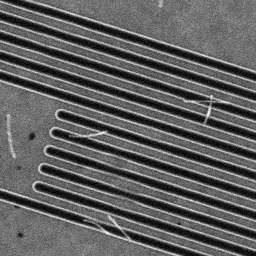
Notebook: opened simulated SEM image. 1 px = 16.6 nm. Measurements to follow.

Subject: groups of lines, slits or small figures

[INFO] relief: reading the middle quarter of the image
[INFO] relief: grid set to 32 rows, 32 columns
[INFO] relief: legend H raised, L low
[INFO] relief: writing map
LLLHHHHHHHHHLLLLLLLHHHHHHHHHLLLL
LLLLLLLHHHHHHHHLLLLLLLLHHHHHHHHL
HHHLLLLLLLHHHHHHHHHLLLLLLHHHHHHH
HHHHHHLLLLLLLHHHHHHHHLLLLLLLHHHH
LHHHHHHHHLLLLLLLHHHHHHHHHLLLLLLL
LLLHHHHHHHHHLLLLLLLHHHHHHHHHLLLL
LLLLLLLHHHHHHHHHLLLLLLLHHHHHHHHL
HHHLLLLLLLHHHHHHHHLLLLLLLLHHHHHH
HHHHHHLLLLLLLHHHHHHHHLLLLLLLLHHH
LHHHHHHHHLLLLLLLHHHHHHHHHLLLLLLL
LLLHHHHHHHHHLLLLLLLHHHHHHHHHLLLL
LLLLLLLHHHHHHHHHLLLLLLLHHHHHHHHL
HHHLLLLLLLHHHHHHHHLLLLLLLLHHHHHH
HHHHHHHLLLLLLLHHHHHHHHLLLLLLLHHH
LHHHHHHHHLLLLLLLHHHHHHHHHLLLLLLL
LLLLHHHHHHHHHLLLLLLLHHHHHHHHLLLL
LLLLLLLHHHHHHHHHLLLLLLLHHHHHHHHH
HHHLLLLLLLLHHHHHHHLLLLLLLLHHHHHH
HHHHHHHLLLLLLLHHHHHHHHLLLLLLLHHH
LHHHHHHHHLLLLLLLHHHHHHHHHLLLLLLL
LLLLHHHHHHHHHLLLLLLLHHHHHHHHHLLL
LLLLLLLHHHHHHHHHLLLLLLLHHHHHHHHH
HHHHLLLLLLLHHHHHHHHLLLLLLLHHHHHH
HHHHHHHLLLLLLLHHHHHHHHLLLLLLLHHH
LHHHHHHHHLLLLLLLLHHHHHHHHLLLLLLL
LLLLHHHHHHHHLLLLLLLLHHHHHHHHHLLL
LLLLLLLHHHHHHHHLLLLLLLLHHHHHHHHH
HHHHLLLLLLLHHHHHHHHLLLLLLLHHHHHH
HHHHHHLLLLLLLLHHHHHHHHLLLLLLLHHH
LHHHHHHHHHLLLLLLLLHHHHHHHHLLLLLL
LLLLHHHHHHHHLLLLLLLLHHHHHHHHHLLL
HLLLLLLLHHHHHHHHLLLLLLLHHHHHHHHH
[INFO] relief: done